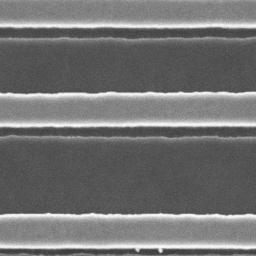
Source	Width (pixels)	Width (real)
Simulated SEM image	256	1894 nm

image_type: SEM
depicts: lines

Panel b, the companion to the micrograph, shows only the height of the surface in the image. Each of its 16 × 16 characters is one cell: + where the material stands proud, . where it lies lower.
++++++++++++++++
++++++++++++++++
................
................
................
................
++++++++++++++++
++++++++++++++++
................
................
................
................
................
++++++++++++++++
++++++++++++++++
................